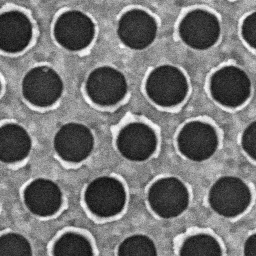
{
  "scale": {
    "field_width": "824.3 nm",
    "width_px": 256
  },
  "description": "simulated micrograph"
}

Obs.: a regular array of holes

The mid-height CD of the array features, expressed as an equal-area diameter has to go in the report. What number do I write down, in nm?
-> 132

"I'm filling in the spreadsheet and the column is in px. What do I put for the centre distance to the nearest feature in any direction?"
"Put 62.5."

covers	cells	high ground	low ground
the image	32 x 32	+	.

++++++++++++++++++++++++++++++++
+..+++++..++++++..++++++..++++++
....+++....++++....++++....+++..
....+++.....+++.....++.....+++..
....+++.....+++....+++.....+++..
....+++....++++....++++....++++.
+.++++++++++++++++++++++++++++++
++++++++++++++++++++++++++++++++
++++..++++++..++++++..++++++..++
+++....++++.....+++....+++.....+
+++.....+++.....++.....+++.....+
+++.....+++.....++.....+++.....+
+++....++++....++++....++++....+
++++++++++++++++++++++++++++++++
++++++++++++++++++++++++++++++++
+.++++++..++++++..+++++...+++++.
...++++.....+++....++++....+++..
....+++.....+++.....++.....+++..
....+++.....+++.....++.....+++..
...++++....++++....++++...+++++.
++++++++++++++++++++++++++++++++
++++++++++++++++++++++++++++++++
++++..++++++...+++++..+++++...++
+++....++++....++++....+++.....+
+++.....+++.....++......++.....+
+++.....+++.....+++.....++.....+
++++...++++....++++....++++...++
++++++++++++++++++++++++++++++++
++++++++++++++++++++++++++++++++
...+++++..++++++..++++++..+++++.
....+++....++++....++++....++++.
....+++.....+++.....++......++..